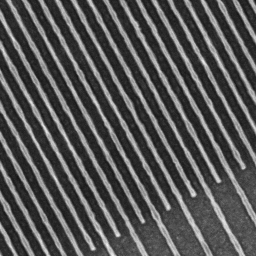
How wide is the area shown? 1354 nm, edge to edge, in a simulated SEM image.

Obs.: parallel lines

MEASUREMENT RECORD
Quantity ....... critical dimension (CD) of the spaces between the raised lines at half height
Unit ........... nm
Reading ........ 55.5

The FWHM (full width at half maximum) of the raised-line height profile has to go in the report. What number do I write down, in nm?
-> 22.7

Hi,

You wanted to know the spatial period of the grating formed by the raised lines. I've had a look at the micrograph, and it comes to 75.4 nanometres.